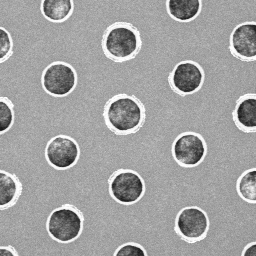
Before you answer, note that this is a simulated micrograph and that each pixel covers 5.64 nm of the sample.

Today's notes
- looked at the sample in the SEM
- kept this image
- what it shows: a regular array of holes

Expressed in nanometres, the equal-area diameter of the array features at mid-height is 181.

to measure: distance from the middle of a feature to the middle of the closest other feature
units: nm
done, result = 408